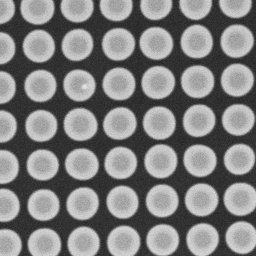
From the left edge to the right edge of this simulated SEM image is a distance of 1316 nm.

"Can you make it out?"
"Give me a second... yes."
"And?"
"an array of small figures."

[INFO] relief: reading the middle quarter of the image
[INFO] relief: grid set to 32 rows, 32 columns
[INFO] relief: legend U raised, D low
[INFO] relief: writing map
DDDDDDDDDDDDDDDDDDDDDDDDDDDDDDDD
DDDUDDDDDDDDUUUUDDDDDUUUUUDDDDUU
DUUUUUDDDDDUUUUUUDDDUUUUUUUDDDUU
UUUUUUUDDDUUUUUUUDDDUUUUUUUUDUUU
UUUUUUUUDDUUUUUUUUDUUUUUUUUUDUUU
UUUUUUUUDDUUUUUUUUDUUUUUUUUUDUUU
UUUUUUUUDDUUUUUUUUDDUUUUUUUDDDUU
DUUUUUUDDDDUUUUUUDDDUUUUUUDDDDDU
DUUUUUDDDDDDUUUUDDDDDDUUUDDDDDDD
DDDDDDDDDDDDDDDDDDDDDDDDDDDDDDDD
DDDDDDDDDDDDDDDDDDDDDDDDDDDDDDDD
DDUUUUDDDDDDUUUUDDDDDUUUUUDDDDDU
DUUUUUUDDDDUUUUUUDDDUUUUUUUDDDUU
UUUUUUUUDDUUUUUUUUDDUUUUUUUUDDUU
UUUUUUUUDDUUUUUUUUDDUUUUUUUUDDUU
UUUUUUUUDDUUUUUUUUDDUUUUUUUUDDUU
UUUUUUUUDDUUUUUUUUDDUUUUUUUUDDUU
DUUUUUUUDDDUUUUUUDDDDUUUUUUDDDDU
DDUUUUUDDDDDUUUDDDDDDDUUUUDDDDDD
DDDDDDDDDDDDDDDDDDDDDDDDDDDDDDDD
DDDDDDDDDDDDDDDDDDDDDDDUUUDDDDDD
DDDUUUDDDDDDUUUUUDDDDUUUUUUDDDDU
DUUUUUUUDDDUUUUUUUDDDUUUUUUUDDUU
DUUUUUUUDDUUUUUUUUDDUUUUUUUUDDUU
UUUUUUUUUDUUUUUUUUDDUUUUUUUUDDUU
UUUUUUUUUDUUUUUUUUDDUUUUUUUUDDUU
DUUUUUUUDDDUUUUUUUDDDUUUUUUUDDDU
DUUUUUUUDDDUUUUUUDDDDUUUUUUDDDDD
DDDUUUUDDDDDDUUUDDDDDDDUDDDDDDDD
DDDDDDDDDDDDDDDDDDDDDDDDDDDDDDDD
DDDDDDDDDDDDDDDDDDDDDDDUUUDDDDDD
DDDUUUUDDDDDUUUUUDDDDDUUUUUUDDDU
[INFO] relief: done